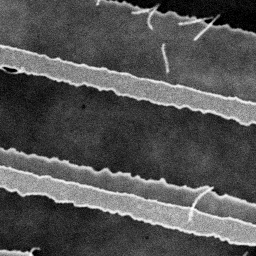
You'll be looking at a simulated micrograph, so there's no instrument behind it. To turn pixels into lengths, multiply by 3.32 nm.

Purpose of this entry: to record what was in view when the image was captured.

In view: lines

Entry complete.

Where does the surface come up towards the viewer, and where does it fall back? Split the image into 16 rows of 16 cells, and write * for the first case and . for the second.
*********.......
*************...
****************
****************
.***************
......**********
..........******
...............*
................
*...............
******..........
***********.....
...************.
........********
............****
................